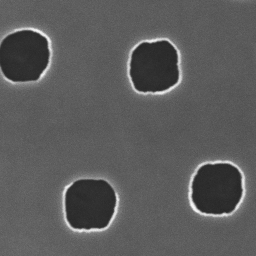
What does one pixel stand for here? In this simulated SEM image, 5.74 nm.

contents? holes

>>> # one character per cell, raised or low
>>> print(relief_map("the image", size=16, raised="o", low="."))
oooooooooooooooo
oooooooooooooooo
...ooooooooooooo
...ooooo...ooooo
...ooooo...ooooo
ooooooooo..ooooo
oooooooooooooooo
oooooooooooooooo
oooooooooooooooo
oooooooooooooooo
ooooooooooooo..o
ooooo..ooooo...o
oooo...ooooo...o
oooo...ooooooooo
oooooooooooooooo
oooooooooooooooo